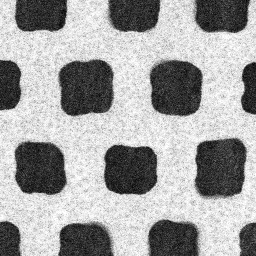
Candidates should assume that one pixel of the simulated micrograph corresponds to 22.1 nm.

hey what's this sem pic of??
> holes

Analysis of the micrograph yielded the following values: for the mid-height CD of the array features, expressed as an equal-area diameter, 1260 nanometers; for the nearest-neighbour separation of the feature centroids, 1.99 micrometres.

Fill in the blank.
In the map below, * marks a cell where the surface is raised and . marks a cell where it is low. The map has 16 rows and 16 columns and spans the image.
*...***...**....
*...***...**...*
****************
****************
.***...**....**.
.***...**....**.
.***...***..***.
****************
****************
*...***...**...*
*...***...**...*
*...***...**...*
****************
****************
.***...**...***.
.***...**...***.